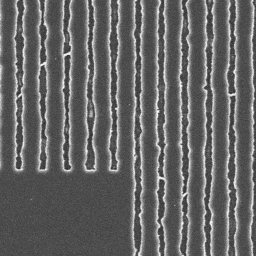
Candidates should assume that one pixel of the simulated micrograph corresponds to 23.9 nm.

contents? parallel lines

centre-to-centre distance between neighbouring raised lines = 0.565 micrometres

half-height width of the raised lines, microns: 0.416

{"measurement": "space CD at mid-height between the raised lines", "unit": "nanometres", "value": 153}